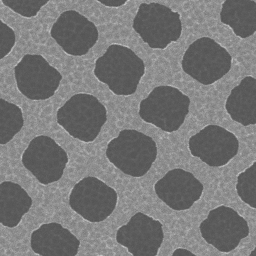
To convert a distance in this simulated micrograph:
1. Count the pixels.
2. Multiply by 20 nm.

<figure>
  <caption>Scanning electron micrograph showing a regular array of holes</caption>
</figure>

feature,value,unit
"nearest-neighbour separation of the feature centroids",1170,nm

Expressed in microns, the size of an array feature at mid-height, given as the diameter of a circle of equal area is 0.91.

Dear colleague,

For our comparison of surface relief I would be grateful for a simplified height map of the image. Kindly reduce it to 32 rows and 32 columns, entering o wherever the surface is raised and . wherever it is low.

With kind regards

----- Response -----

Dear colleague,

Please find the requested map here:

o.....ooooooo..ooo..oooooooo....
oo...ooo..ooooooo.....oooooo....
ooooooo....oooooo......ooooo....
.ooooo......ooooo......oooooo...
..oooo......ooooo......ooooooo.o
..ooooo.....oooooo...ooo...ooooo
.ooooooo...oo....oooooo......ooo
ooo...oooooo......ooooo......ooo
oo.....ooooo......ooooo......ooo
oo......oooo......oooooo....oooo
oo.....oooooo....oooooooo.oooo..
ooo....ooooooo...oo....oooooo...
.ooo.ooo....oooooo......oooo....
..ooooo......oooo.......oooo....
...oooo......ooooo.....oooooo...
...oooo......oooooo....ooooooo..
..oooooo....ooo...ooooooo....ooo
.ooo...ooo..oo.....ooooo......oo
ooo.....ooooo.......oooo......oo
ooo.....ooooo.......oooo.....ooo
ooo.....oooooo.....ooooooo..oooo
oooo....ooooooo...ooo...oooooo..
ooooo..ooo...ooooooo.....ooooo..
...oooooo.....ooooo......ooooo..
....ooooo......ooooo.....ooooo..
....ooooo......oooooo...ooooooo.
...oooooo.....oooooooooooo....oo
...oooooooo..ooo....ooooo......o
ooooo...ooooooo.....ooooo......o
oooo.....ooooo......ooooo......o
oooo......ooooo.....oooooo....oo
oooo......oooooo....oo..oooo.oo.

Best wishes